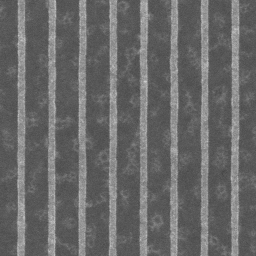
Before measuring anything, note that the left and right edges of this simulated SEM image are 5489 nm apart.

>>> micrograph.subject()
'parallel lines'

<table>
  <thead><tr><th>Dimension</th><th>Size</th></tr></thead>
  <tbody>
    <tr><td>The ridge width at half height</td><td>0.134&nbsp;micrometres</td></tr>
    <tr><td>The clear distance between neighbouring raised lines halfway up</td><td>525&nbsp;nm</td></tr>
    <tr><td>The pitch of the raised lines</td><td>655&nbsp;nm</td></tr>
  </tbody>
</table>